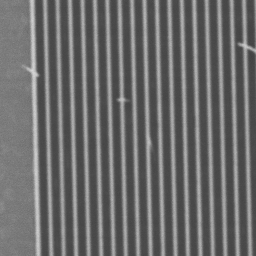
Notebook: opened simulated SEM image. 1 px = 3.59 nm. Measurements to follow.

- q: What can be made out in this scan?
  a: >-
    parallel lines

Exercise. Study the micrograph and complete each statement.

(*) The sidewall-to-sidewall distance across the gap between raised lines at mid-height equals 30.5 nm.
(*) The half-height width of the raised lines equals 3.76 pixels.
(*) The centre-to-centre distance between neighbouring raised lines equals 44.6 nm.